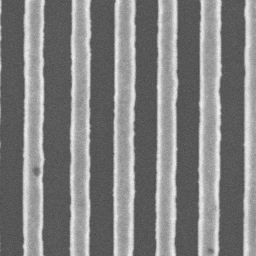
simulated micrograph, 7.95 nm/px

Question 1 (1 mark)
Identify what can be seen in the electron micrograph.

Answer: lines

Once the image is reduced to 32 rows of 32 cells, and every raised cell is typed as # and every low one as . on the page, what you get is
...###...##...###...##...###...#
...##....##...###...##...###...#
...##....##...###...##...###...#
...##....##...###...##...###...#
...##....##...###...##...###...#
...##....##...###...##...###...#
...##....##...###...##...###...#
...##....##...###...##...###...#
...##....##...###...##...###...#
...##....##...###...##...###...#
...##....##...###...##...##....#
...##....##...###...##...##....#
...##....##...###...##...##....#
...##....##...###...##...###...#
...##....##...###...##...###...#
...##....##...###...##...###...#
...##....##...###...##...###...#
...##....##...###...##...###...#
...##....##...###...##...##....#
...##....##...###...##...##....#
...##....##...###...##...##....#
...##....##...###...##...##....#
...##....##...###...##...##....#
...##....##...###...##...##....#
...##....##...###...##...##....#
...##....##...###...##...##....#
...##....##...###...##...##....#
...##....##...###...##...##....#
...##....##...###...##...##....#
...##....##...###...##...##....#
...##....##...###...##...##....#
...##....##...###...##...##....#